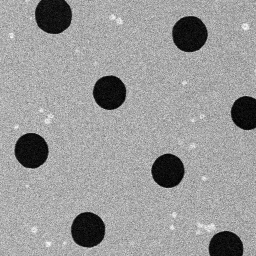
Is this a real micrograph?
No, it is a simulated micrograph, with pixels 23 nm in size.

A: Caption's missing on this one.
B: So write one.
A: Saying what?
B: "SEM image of holes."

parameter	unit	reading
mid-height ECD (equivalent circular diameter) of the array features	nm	802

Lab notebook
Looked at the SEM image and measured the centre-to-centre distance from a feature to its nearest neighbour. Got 2240 nanometres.